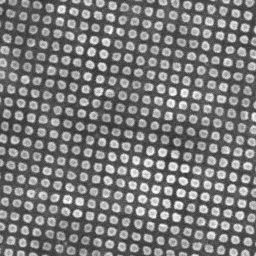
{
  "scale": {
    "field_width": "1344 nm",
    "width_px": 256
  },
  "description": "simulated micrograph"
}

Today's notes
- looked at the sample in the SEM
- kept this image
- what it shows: a regular array of raised bodies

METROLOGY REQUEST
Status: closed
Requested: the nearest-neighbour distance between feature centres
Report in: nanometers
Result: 62.9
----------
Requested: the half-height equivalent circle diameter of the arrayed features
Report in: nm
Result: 41